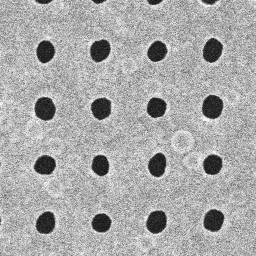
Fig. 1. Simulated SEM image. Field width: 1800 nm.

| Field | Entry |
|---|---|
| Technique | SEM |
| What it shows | a regular array of holes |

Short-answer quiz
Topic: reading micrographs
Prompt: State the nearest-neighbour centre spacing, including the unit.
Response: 389 nm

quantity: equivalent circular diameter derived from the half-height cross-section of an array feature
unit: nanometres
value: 151